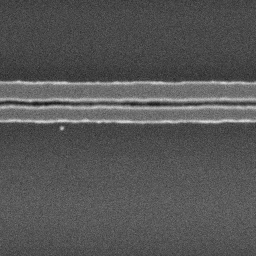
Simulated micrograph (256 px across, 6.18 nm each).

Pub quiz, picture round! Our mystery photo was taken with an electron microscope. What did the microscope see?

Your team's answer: lines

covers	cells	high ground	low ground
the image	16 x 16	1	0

0000000000000000
0000000000000000
0000000000000000
0000000000000000
0000000000000000
1111111111111111
1111111111111111
1111111111111111
0000000000000000
0000000000000000
0000000000000000
0000000000000000
0000000000000000
0000000000000000
0000000000000000
0000000000000000